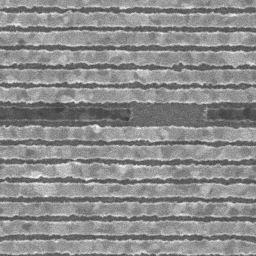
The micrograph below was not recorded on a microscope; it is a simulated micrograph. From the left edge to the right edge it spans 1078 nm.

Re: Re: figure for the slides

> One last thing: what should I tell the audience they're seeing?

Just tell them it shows parallel lines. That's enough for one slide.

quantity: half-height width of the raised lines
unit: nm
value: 57.4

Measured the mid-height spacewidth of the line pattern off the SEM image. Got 23.2 nanometers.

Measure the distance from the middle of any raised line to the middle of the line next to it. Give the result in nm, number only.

79.8